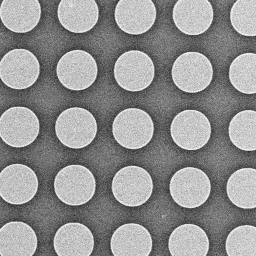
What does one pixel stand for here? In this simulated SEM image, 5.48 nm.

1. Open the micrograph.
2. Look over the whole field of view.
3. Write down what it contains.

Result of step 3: an array of small figures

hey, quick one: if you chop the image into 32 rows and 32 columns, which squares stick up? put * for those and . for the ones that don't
*****...****...****...****...***
*****..*****..*****...*****..***
*****..*****..*****...*****..***
.***....***....****...****...***
................................
................................
.***.....**.....**..............
*****...****...****...****...***
*****..*****..*****...****...***
*****..*****..*****...*****..***
.***....***....****...****...***
.......................**.....**
................................
..*......*......................
****...*****...****...****...***
*****..*****..*****..*****...***
*****..*****..*****..*****...***
****...****....****...****...***
................*......**.....**
................................
................................
****...****....***....***....***
*****..*****..*****..*****...***
*****..*****..*****..*****..****
****...****...*****...****...***
.........*.....***....***....***
................................
................................
****....***....***....***.....**
****...*****..*****..*****...***
*****..*****..*****..*****..****
****...****...*****..*****..****